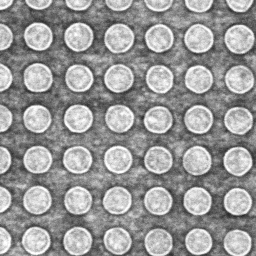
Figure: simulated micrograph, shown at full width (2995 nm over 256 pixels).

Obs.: a regular array of raised bodies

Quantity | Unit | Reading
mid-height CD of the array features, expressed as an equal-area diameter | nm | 316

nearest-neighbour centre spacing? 39.9 px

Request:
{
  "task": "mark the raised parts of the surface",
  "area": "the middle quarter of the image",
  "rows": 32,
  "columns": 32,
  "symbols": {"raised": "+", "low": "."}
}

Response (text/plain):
...+........+++........++.......
.+++++.....+++++.....+++++.....+
.++++++...+++++++....++++++....+
.++++++...+++++++....++++++...++
.++++++...+++++++....++++++...++
.+++++.....+++++.....++++++....+
..+++.......+++.......++++......
................................
................................
................................
..+++...........................
.+++++.....+++++.....+++++.....+
+++++++....++++++....++++++...++
+++++++....++++++...+++++++...++
+++++++....++++++...+++++++...++
.+++++.....++++++...+++++++....+
..+++.......++++.....+++++......
................................
................................
................................
................................
.+++++.....+++++.....++++......+
++++++.....++++++....++++++...++
+++++++...+++++++...+++++++...++
+++++++...+++++++...+++++++...++
++++++.....++++++...+++++++...++
.+++++......++++.....+++++.....+
................................
................................
................................
................................
..++++......+++.......+++......+